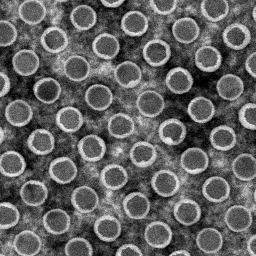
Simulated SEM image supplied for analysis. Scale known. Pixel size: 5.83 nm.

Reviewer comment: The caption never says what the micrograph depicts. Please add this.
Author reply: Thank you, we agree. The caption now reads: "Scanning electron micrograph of a regular array of raised bodies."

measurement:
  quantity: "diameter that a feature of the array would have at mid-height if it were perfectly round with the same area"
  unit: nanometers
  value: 145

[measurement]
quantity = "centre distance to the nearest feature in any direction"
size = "210 nm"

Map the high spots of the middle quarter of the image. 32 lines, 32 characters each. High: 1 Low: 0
11111100000000111100000000000000
11111100000001111110000000011100
01111100000001111110000000111110
01111000000001111110000000111111
00000000000000111110000000111111
00000000100000011000000000111111
00000011111000000000000000011110
00000011111100000000111000000000
00000011111100000001111100000000
00000011111100000011111110000000
00000001111000000011111110000001
11100000000000000001111100000001
11110000000000100000111000000001
11110000000011110000000000000000
11110000000111111000000001111000
11110000000111111000000011111100
11100000000111111000000011111100
00000000000011111000000011111100
00000111100000000000000011111100
00001111110000000000000000111000
00001111110000000111110000000000
00001111110000000111110000000001
00001111110000000111111000000011
10000111100000000111111000000111
11000000000000000111110000000111
11100000000111000000000000000011
11100000001111100000000000000001
11100000011111110000000111100000
11000000011111110000000111110000
10000000001111100000001111111000
00000000000111000000001111111000
00011110000000000000000111110000